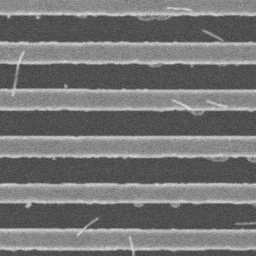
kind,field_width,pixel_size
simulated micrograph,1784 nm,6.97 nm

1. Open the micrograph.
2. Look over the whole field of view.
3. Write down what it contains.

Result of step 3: lines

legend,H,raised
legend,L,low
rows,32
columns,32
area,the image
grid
HHHHHHHHHHHHHHHHHHHHHHHHHHHHHHHH
HHHHHHHHHHHHHHHHHHHHHHHHHHHHHHHH
LLLLLLLLLLLLLLLLLLLLLLLLLLLLLLLL
LLLLLLLLLLLLLLLLLLLLLLLLLLLLLLLL
LLLLLLLLLLLLLLLLLLLLLLLLLLLLLLLL
HHHHHHHHHHHHHHHHHHHHHHHHHHHHHHHH
HHHHHHHHHHHHHHHHHHHHHHHHHHHHHHHH
HHHHHHHHHHHHHHHHHHHHHHHHHHHHHHHH
LLLLLLLLLLLLLLLLLLLLLLLLLLLLLLLL
LLLLLLLLLLLLLLLLLLLLLLLLLLLLLLLL
LLLLLLLLLLLLLLLLLLLLLLLLLLLLLLLL
HHHHHHHHHHHHHHHHHHHHHHHHHHHHHHHH
HHHHHHHHHHHHHHHHHHHHHHHHHHHHHHHH
HHHHHHHHHHHHHHHHHHHHHHHHHHHHHHHH
LLLLLLLLLLLLLLLLLLLLLLLLLLLLLLLL
LLLLLLLLLLLLLLLLLLLLLLLLLLLLLLLL
LLLLLLLLLLLLLLLLLLLLLLLLLLLLLLLL
HHHHHHHHHHHHHHHHHHHHHHHHHHHHHHHH
HHHHHHHHHHHHHHHHHHHHHHHHHHHHHHHH
HHHHHHHHHHHHHHHHHHHHHHHHHHHHHHHH
LLLLLLLLLLLLLLLLLLLLLLLLLLLLLLLL
LLLLLLLLLLLLLLLLLLLLLLLLLLLLLLLL
LLLLLLLLLLLLLLLLLLLLLLLLLLLLLLLL
HHHHHHHHHHHHHHHHHHHHHHHHHHHHHHHH
HHHHHHHHHHHHHHHHHHHHHHHHHHHHHHHH
LLLLLLLLLLLLLLLLLLLLLLLLLLLLLLLL
LLLLLLLLLLLLLLLLLLLLLLLLLLLLLLLL
LLLLLLLLLLLLLLLLLLLLLLLLLLLLLLLL
LLLLLLLLLLLLLLLLLLLLLLLLLLLLLLLL
HHHHHHHHHHHHHHHHHHHHHHHHHHHHHHHH
HHHHHHHHHHHHHHHHHHHHHHHHHHHHHHHH
LLLLLLLLLLLLLLLLLLLLLLLLLLLLLLLL